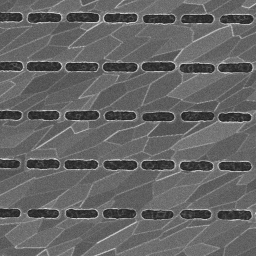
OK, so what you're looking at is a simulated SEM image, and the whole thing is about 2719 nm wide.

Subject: a regular array of holes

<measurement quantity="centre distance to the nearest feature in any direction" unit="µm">0.405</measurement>